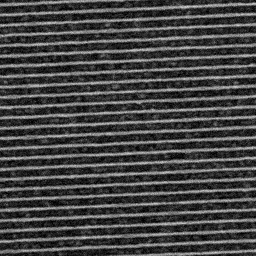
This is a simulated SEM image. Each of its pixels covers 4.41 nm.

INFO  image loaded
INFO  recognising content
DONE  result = parallel lines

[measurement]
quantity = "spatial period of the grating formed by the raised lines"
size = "45.3 nm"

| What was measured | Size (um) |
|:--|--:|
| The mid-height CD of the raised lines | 0.011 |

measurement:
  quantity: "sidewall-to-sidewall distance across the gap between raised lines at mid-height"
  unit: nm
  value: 35.2